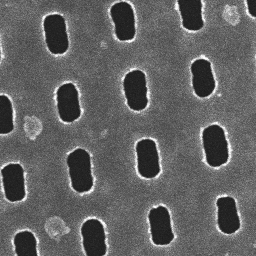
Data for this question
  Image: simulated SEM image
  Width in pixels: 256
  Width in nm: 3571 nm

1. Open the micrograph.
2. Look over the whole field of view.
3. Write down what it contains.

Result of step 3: a regular array of holes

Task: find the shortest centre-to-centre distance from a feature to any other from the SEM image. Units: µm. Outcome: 0.948